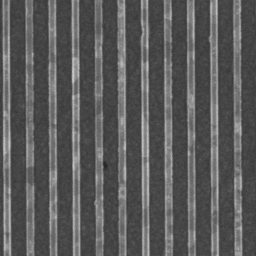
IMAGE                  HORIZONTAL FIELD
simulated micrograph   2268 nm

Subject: parallel lines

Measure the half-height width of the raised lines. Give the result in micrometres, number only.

0.0565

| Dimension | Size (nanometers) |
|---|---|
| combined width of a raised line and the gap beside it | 204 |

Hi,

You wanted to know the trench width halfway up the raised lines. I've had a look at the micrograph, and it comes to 153 nanometres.